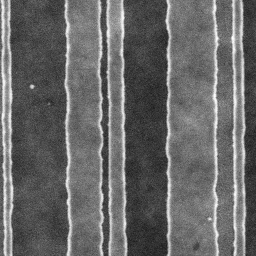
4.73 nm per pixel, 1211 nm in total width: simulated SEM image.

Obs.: lines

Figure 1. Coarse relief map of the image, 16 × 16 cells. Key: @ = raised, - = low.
@---@@@@--@@@@@-
@---@@@@--@@@@@-
@---@@@@---@@@@-
@---@@@@---@@@@-
@---@@@@---@@@@-
@---@@@@---@@@@-
@---@@@@--@@@@@-
@---@@@@--@@@@@-
@---@@@@--@@@@@-
@---@@@@--@@@@@-
@---@@@@---@@@@-
@---@@@@---@@@@-
@---@@@@---@@@@-
@---@@@@---@@@@-
@---@@@@---@@@@-
@---@@@@---@@@@-